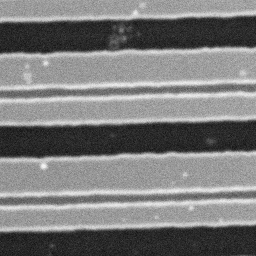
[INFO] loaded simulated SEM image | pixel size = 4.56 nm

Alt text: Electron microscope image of lines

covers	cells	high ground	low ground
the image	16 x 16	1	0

1111111111111111
0000000000000000
0000000000000000
1111111111111111
1111111111111111
1111111111111111
1111111111111111
1111111111111000
0000000000000000
0000000000000000
1111111111111111
1111111111111111
1111111111111111
1111111111111111
0000000000000000
0000000000000000